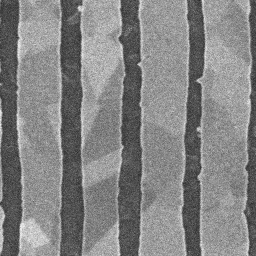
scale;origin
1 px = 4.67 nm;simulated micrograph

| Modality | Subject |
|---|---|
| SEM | one or a few lines or trenches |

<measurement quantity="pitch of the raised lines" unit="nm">288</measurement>